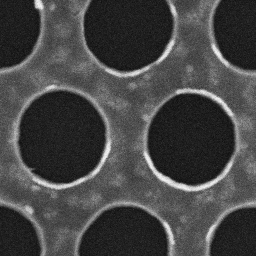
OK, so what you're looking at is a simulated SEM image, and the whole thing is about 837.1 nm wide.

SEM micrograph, holes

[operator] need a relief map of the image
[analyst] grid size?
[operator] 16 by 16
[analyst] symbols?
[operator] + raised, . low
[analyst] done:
..+++......++...
...++......++...
..+++......++...
..++++....++++..
++++++++++++++++
++++++++++++++++
++....++++....++
+......++.....++
+......++......+
+.....+++......+
++....++++....++
++++++++++++.+++
++++++++++++++++
..++++....++++..
..+++.....+++...
...++......++...